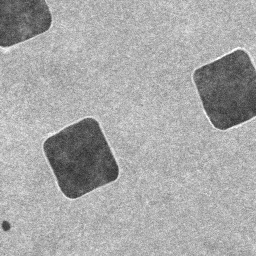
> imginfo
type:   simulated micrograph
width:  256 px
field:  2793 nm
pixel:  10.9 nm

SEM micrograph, holes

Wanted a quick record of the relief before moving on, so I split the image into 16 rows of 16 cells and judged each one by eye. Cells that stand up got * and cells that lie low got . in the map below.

...*************
...*************
..**************
**************..
************....
************....
*************...
*****.*******...
***....*********
***....*********
***....*********
****...*********
****************
****************
****************
****************